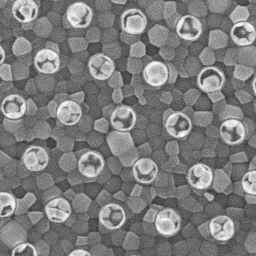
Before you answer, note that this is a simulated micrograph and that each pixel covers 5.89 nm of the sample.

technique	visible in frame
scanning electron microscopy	a regular array of raised bodies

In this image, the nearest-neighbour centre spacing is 28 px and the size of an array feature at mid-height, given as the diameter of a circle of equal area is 0.126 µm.